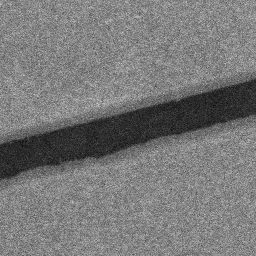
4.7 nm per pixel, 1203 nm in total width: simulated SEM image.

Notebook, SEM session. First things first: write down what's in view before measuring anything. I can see one or a few lines or trenches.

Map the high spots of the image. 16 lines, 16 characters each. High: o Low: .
oooooooooooooooo
oooooooooooooooo
oooooooooooooooo
oooooooooooooooo
oooooooooooooooo
oooooooooooo....
oooooooo........
oooo............
.............ooo
.........ooooooo
.....ooooooooooo
.ooooooooooooooo
oooooooooooooooo
oooooooooooooooo
oooooooooooooooo
oooooooooooooooo